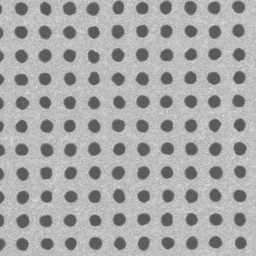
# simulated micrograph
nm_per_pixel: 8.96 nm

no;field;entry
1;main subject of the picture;a regular array of holes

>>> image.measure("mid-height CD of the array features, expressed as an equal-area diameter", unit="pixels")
12.7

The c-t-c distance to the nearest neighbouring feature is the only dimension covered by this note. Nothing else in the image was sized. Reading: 208 nanometres